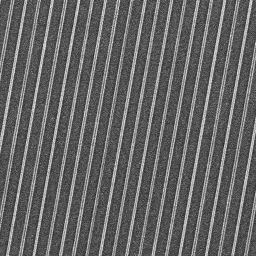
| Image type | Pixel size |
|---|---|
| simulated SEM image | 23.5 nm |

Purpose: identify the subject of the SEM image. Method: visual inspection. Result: parallel lines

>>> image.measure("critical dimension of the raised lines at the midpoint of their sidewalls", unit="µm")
0.0433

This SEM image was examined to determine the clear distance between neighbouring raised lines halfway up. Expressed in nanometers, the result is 254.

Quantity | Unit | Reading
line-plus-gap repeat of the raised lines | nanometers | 306